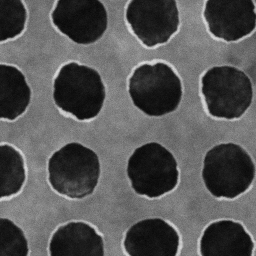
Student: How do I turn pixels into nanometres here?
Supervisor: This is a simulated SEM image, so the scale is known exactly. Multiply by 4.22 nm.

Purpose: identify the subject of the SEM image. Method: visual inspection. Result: holes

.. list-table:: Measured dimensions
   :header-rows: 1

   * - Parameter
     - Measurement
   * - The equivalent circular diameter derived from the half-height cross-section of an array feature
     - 0.222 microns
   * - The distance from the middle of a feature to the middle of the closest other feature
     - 317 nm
